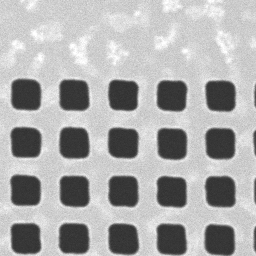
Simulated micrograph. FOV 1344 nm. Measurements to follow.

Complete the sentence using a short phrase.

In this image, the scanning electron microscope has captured a regular array of holes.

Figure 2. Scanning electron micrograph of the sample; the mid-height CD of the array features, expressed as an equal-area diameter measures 0.172 microns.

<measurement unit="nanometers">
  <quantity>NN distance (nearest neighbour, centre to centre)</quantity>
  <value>251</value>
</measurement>